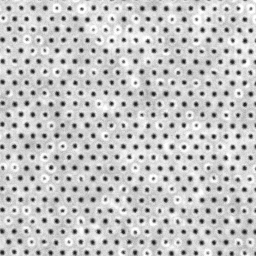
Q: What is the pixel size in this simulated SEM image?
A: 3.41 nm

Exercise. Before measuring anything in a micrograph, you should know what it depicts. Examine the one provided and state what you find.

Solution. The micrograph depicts a regular array of holes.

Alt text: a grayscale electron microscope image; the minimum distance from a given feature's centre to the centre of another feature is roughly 39.7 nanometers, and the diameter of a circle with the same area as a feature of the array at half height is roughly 0.0181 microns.